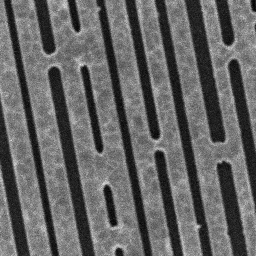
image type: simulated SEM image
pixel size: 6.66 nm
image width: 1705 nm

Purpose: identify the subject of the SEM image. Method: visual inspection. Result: parallel lines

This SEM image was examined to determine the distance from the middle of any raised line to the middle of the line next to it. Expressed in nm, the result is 201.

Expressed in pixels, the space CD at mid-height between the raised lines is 11.7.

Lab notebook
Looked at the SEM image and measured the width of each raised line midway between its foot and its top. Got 125 nm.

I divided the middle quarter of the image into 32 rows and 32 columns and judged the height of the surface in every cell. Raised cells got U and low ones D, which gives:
UUUUDDUUUUUDDUUUUUDDDUUUUDDDDUUU
UUUUDDUUUUUDDDUUUUDDDUUUUUDDDUUU
UUUUDDDUUUUDDDUUUUUDDUUUUUDDDUUU
UUUUDDDUUUUDDDUUUUUDDDUUUUDDDUUU
UUUUUDDUUUUUDDUUUUUDDDUUUUDDDUUU
UUUUUDDUUUUUDDUUUUUDDDUUUUDDDUUU
UUUUUDDUUUUUDDDUUUUDDDUUUUUDDDUU
UUUUUDDUUUUUDDDUUUUDDDDUUUUDDDUU
DUUUUDDDUUUUDDDUUUUUDDDUUUUDDDUU
DUUUUDDDUUUUUDDUUUUUDDDUUUUDDDUU
DUUUUUDDUUUUUDDUUUUUDDDUUUUDDDUU
DUUUUUDDUUUUUDDDUUUUDDDUUUUUDDDU
DUUUUUDDUUUUUDDDUUUUDDDDUUUUDDDU
DDUUUUDDDUUUUDDDUUUUUDDDUUUUDDDU
DDUUUUDDDUUUUDDDUUUUUDDDUUUUDDDU
DDUUUUUDDUUUUUDDUUUUUDDDUUUUDDDU
DDUUUUUDDUUUUUDDUUUUUDDDUUUUDDDD
DDUUUUUDDUUUUUDDDUUUUDDDUUUUUDDD
DDUUUUUDDDUUUUDDDUUUUUDDUUUUUDDD
DDDUUUUDDDUUUUDDDUUUUUUUUUUUUDDD
DDDUUUUUDDUUUUUDDUUUUUUUUUUUUDDD
DDDUUUUUDDUUUUUDDUUUUUUDDUUUUDDD
DDDUUUUUUUUUUUUDDDUUUUDDDUUUUUDD
DDDUUUUUUUUUUUUDDDUUUUDDDDUUUUDD
DDDDUUUUUUUUUUUDDDUUUUUDDDUUUUDD
DDDDUUUUUUUUUUUUDDUUUUUDDDUUUUDD
DDDDUUUUUUUUUUUUDDUUUUUDDDUUUUDD
DDDDUUUUUUUUUUUUDDDUUUUDDDUUUUUD
UDDDUUUUUUUUUUUUDDDUUUUDDDUUUUUD
UDDDDUUUUUUUUUUUUDDUUUUUDDUUUUUD
UDDDDUUUUUDDUUUUUDDUUUUUDDDUUUUD
UDDDDUUUUUDDUUUUUDDUUUUUDDDUUUUD